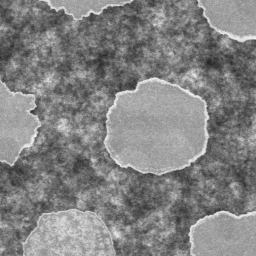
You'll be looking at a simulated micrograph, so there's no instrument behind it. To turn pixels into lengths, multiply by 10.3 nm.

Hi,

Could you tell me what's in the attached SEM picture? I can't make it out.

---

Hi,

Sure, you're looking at raised bodies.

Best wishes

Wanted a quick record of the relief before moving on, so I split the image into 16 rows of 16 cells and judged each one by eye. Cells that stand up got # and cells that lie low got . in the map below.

...####......###
.............###
................
................
................
#.......###.....
##.....######...
##.....######...
##.....######...
#......######...
........###.....
................
................
.............###
............####
............####